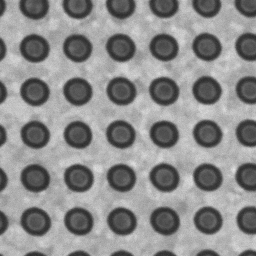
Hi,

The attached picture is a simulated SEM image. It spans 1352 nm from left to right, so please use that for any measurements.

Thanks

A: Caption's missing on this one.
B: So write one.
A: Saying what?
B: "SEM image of a regular array of ring-shaped grooves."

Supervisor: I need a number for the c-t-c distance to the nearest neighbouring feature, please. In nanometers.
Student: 226